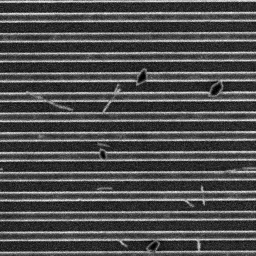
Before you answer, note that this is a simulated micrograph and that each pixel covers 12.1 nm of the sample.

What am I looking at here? parallel lines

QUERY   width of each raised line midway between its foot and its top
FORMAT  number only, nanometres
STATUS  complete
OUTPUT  103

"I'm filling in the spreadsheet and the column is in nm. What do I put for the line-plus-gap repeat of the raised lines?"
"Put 241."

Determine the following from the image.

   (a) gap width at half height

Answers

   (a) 133 nanometres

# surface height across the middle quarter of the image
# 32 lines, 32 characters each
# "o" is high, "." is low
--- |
................................
................................
oooooooooooooooooooooooooooooooo
oooooooooooooooooooooooooooooooo
..................oo............
................................
................................
oooooooooooooooooooooooooooooooo
oooooooooooooooooooooooooooooooo
...........o....................
................................
................................
oooooooooooooooooooooooooooooooo
oooooooooooooooooooooooooooooooo
................................
................................
................................
oooooooooooooooooooooooooooooooo
oooooooooooooooooooooooooooooooo
................................
................................
.........o......................
oooooooooooooooooooooooooooooooo
oooooooooooooooooooooooooooooooo
................................
................................
................................
oooooooooooooooooooooooooooooooo
oooooooooooooooooooooooooooooooo
................................
................................
................................